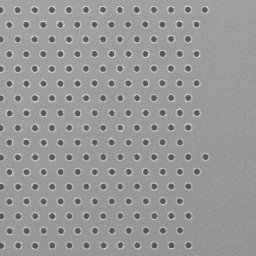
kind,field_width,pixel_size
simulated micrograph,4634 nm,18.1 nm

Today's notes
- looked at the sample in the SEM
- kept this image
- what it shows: a regular array of holes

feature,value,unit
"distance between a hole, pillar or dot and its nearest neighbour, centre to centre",303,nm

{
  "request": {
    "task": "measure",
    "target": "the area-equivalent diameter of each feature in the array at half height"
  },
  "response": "0.112 microns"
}